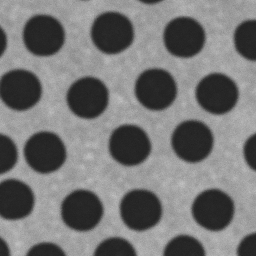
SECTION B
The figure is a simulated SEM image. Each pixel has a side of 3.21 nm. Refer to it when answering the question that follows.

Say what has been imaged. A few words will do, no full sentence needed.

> a regular array of holes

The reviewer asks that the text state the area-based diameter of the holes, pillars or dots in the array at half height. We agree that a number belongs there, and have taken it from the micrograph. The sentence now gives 135 nm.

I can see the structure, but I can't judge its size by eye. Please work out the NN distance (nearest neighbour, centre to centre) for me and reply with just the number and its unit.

0.195 um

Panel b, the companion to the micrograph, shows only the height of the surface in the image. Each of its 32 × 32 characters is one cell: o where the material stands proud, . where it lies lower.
oooooooooooooooooooooooooooooooo
ooooooooooooo.oooooooooooooooooo
oooo...ooooo....oooooo..ooooooo.
ooo.....ooo......oooo....ooooo..
.oo.....ooo......ooo......ooo...
.oo.....oooo....ooooo.....ooo...
oooo...oooooo..oooooo....ooooo..
oooooooooooooooooooooooooooooooo
oooooooooooooooooooooooooooooooo
....ooooooooooooo....ooooo..oooo
.....oooo....oooo.....ooo....ooo
.....ooo.....oooo.....oo......oo
.....ooo......ooo.....ooo.....oo
o...ooooo....ooooo...oooo....ooo
oooooooooo..oooooooooooooooooooo
ooooooooooooooooooooooo...oooooo
ooooo.oooooooo....oooo....oooooo
.oo.....oooooo.....oo......oooo.
..o.....oooooo.....ooo....ooooo.
..o.....oooooo....oooo....ooooo.
..oo....ooooooo..oooooooooooooo.
.oooo.oooooooooooooooooooooooooo
o.oooooooooooooooooooooooooooooo
....oooooooooooooooooooooooooooo
....oooo....oooo....ooooo....ooo
....oooo.....oo.....oooo.....ooo
....oooo.....oo.....oooo.....ooo
oooooooo.....oo.....oooo.....ooo
ooooooooo...oooo...ooooooo..oooo
oooooooooooooooooooooo..ooooooo.
.oooo..ooooo....ooooo....ooooo..
.ooo....oooo.....ooo......oooo..